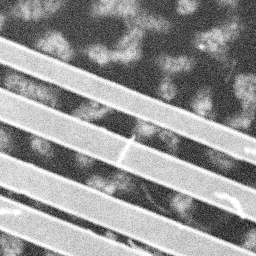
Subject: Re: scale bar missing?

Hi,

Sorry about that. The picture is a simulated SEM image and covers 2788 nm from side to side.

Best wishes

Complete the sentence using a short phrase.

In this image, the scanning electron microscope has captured parallel lines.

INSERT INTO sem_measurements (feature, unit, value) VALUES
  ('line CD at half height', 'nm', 296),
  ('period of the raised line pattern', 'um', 0.569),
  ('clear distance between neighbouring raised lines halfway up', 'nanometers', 286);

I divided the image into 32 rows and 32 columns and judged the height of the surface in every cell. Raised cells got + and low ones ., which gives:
................................
................................
................................
................................
................................
++..............................
++++............................
+++++++.........................
..+++++++.......................
.....+++++++....................
.......+++++++..................
+.........++++++................
+++.........+++++++.............
++++++.........+++++++..........
++++++++.........+++++++........
..+++++++++.........+++++++.....
....+++++++++.........+++++++...
.......+++++++++.........+++++++
.........+++++++++.........+++++
+...........+++++++++........+++
+++...........+++++++++.........
++++++...........+++++++++......
++++++++...........+++++++++....
.++++++++++...........+++++++++.
....+++++++++...........++++++++
++....++++++++++...........+++++
+++++....+++++++++...........+++
+++++++....++++++++++...........
++++++++++....+++++++++.........
..++++++++++.....+++++++++......
.....++++++++++....+++++++++....
.......++++++++++....++++++++++.